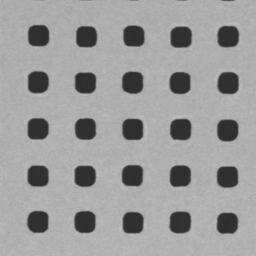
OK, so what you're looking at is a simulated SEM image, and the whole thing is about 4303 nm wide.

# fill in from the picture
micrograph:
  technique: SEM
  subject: a regular array of holes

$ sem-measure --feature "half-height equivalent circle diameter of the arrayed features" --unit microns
0.381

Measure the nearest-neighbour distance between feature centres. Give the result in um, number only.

0.78